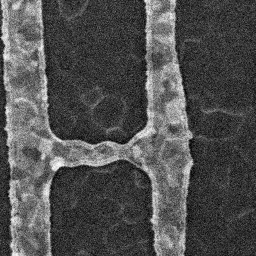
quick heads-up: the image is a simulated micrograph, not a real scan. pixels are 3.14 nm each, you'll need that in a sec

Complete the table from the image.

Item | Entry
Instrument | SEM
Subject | one or a few lines or trenches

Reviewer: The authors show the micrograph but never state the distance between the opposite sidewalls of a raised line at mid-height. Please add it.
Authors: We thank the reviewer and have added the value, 119 nm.